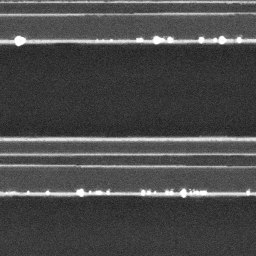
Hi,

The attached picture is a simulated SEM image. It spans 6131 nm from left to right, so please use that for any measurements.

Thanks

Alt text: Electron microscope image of lines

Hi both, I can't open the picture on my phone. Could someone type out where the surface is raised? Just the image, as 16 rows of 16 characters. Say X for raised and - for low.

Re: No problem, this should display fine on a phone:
XXXXXXXXXXXXXXXX
XXXXXXXXXXXXXXXX
XX----X-XXX-XXX-
----------------
----------------
----------------
----------------
----------------
----------------
XXXXXXXXXXXXXXXX
XXXXXXXXXXXXXXXX
XXXXXXXXXXXXXXXX
----------------
----------------
----------------
----------------